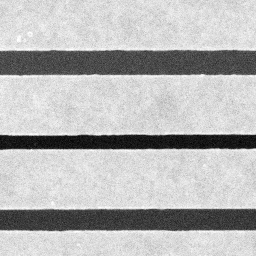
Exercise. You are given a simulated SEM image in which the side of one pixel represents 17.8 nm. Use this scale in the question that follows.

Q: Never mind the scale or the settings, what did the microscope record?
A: lines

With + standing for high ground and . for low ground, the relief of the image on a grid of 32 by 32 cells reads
++++++++++++++++++++++++++++++++
++++++++++++++++++++++++++++++++
++++++++++++++++++++++++++++++++
++++++++++++++++++++++++++++++++
++++++++++++++++++++++++++++++++
++++++++++++++++++++++++++++++++
................................
................................
................................
++++++++++++++++++++++++++++++++
++++++++++++++++++++++++++++++++
++++++++++++++++++++++++++++++++
++++++++++++++++++++++++++++++++
++++++++++++++++++++++++++++++++
++++++++++++++++++++++++++++++++
++++++++++++++++++++++++++++++++
++++++++++++++++++++++++++++++++
................................
................................
++++++++++++++++++++++++++++++++
++++++++++++++++++++++++++++++++
++++++++++++++++++++++++++++++++
++++++++++++++++++++++++++++++++
++++++++++++++++++++++++++++++++
++++++++++++++++++++++++++++++++
++++++++++++++++++++++++++++++++
................................
................................
................................
++++++++++++++++++++++++++++++++
++++++++++++++++++++++++++++++++
++++++++++++++++++++++++++++++++